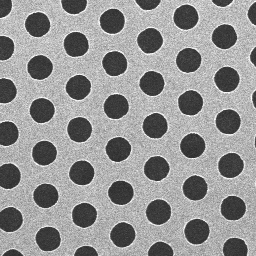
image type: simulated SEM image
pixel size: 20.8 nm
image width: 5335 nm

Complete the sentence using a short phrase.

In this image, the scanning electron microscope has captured a regular array of holes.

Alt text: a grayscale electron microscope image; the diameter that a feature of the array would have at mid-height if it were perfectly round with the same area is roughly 527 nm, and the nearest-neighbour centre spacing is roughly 882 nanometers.